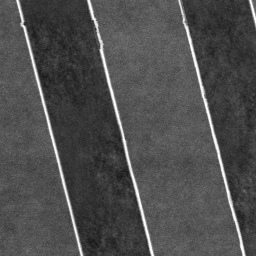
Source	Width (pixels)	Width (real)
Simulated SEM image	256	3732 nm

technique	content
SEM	one or a few lines or trenches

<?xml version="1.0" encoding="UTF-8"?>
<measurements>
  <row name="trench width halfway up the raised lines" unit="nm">1000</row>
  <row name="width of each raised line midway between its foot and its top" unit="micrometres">1.28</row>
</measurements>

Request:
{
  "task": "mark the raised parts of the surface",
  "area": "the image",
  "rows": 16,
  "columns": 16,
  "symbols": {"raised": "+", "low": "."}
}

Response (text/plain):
+.....+++++.....
+.....++++++....
++....++++++....
++....++++++....
++.....+++++....
++.....++++++...
+++....++++++...
+++....++++++...
+++.....+++++...
+++.....++++++..
++++....++++++..
++++....++++++..
++++.....+++++..
++++.....++++++.
+++++....++++++.
+++++....++++++.